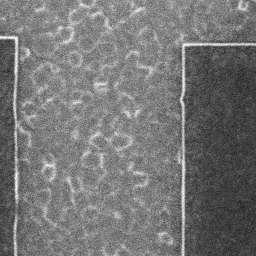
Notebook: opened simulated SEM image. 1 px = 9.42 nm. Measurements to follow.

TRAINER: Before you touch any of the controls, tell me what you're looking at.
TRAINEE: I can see one or a few lines or trenches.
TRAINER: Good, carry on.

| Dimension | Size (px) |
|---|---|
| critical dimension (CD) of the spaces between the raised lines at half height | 168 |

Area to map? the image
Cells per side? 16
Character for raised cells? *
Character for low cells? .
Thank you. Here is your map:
................
................
*...............
*..........*****
*..........*****
*..........*****
*..........*****
*..........*****
*..........*****
*..........*****
*..........*****
*..........*****
*..........*****
*..........*****
*..........*****
*..........*****